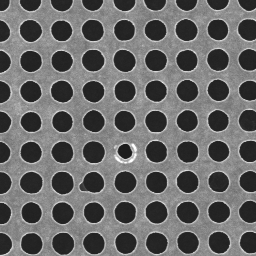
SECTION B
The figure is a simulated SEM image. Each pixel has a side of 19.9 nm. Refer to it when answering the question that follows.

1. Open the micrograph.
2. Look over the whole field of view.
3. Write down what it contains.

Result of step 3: a regular array of holes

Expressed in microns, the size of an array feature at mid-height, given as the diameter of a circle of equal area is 0.427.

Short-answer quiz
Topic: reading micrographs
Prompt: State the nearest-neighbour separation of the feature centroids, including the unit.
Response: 0.603 µm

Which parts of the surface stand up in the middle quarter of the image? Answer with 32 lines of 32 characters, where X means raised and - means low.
--XXX-----XXX-----XXX----XXX----
-XXXXX---XXXXX---XXXXX---XXXX---
XXXXXXXXXXXXXXXXXXXXXXXXXXXXXXXX
XXXXXXXXXXXXXXXXXXXXXXXXXXXXXXXX
-XXXXX---XXXXX---XXXX---XXXXX---
--XXX-----XXX-----XXX----XXX----
--XX------XXX-----XX------XX----
--XXX-----XXX-----XX------XX----
--XXX-----XXX----XXXX----XXXX---
-XXXXXX-XXXXXXX-XXXXXXXXXXXXXXXX
XXXXXXXXXXXXXXXXXXXXXXXXXXXXXXXX
XXXXXXXXXXXXXXXXXXXXXXXXXXXXXXXX
-XXXXX---XXXX----XXXX----XXXX---
--XXX-----XXX-----XX------XX----
--XXX-----XXX-----XX------XX----
--XXX-----XXX-----XXX-----XXX---
-XXXXX---XXXXX---XXXX----XXXX---
XXXXXXXXXXXXXXXXXXXXXXXXXXXXXXXX
XXXXXXXXXXXXXXXXXXXXXXXXXXXXXXXX
XXXXXXX-XXXXXXXXXXXXXX--XXXXXX--
--XXX-----XXXX--XXXXX----XXXX---
--XXX-----XXXX---XXX------XX----
--XXX-----XXXX---XXX------XX----
--XXX-----XXXXX-XXXXX-----XXX---
-XXXXX---XXXXXXXXXXXXX--XXXXXX--
XXXXXXXXXXXXXXXXXXXXXXXXXXXXXXXX
XXXXXXXXXXXXXXXXXXXXXXXXXXXXXXXX
-XXXXX---XXXXX---XXXX----XXXX---
--XXX-----XXX-----XXX-----XX----
--XXX-----XXX-----XXX-----XX----
---XX-----XXX-----XXX-----XX----
--XXXX---XXXXX---XXXX----XXXX---